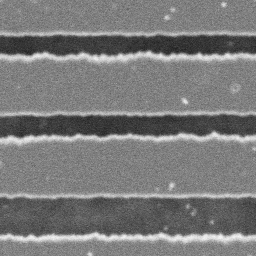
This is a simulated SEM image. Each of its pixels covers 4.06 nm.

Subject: lines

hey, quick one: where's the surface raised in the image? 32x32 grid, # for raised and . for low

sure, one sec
################################
################################
################################
################################
................................
................................
..................#.............
################################
################################
################################
################################
################################
################################
################################
................................
................................
................................
################################
################################
################################
################################
################################
################################
################################
################################
................................
................................
................................
................................
##.#.########.#######.#.####.###
################################
################################